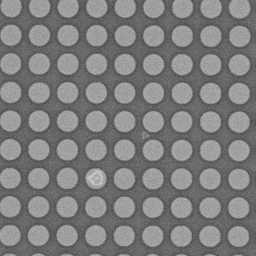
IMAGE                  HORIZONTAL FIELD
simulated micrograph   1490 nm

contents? an array of small figures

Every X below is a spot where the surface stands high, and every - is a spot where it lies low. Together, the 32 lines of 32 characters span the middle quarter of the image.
XXX---XXXXX--XXXXX--XXXXX--XXXXX
XXX---XXXX---XXXX---XXXX---XXXXX
XX-----XX-----XX-----XX------XX-
--------------------------------
--------------------------------
XXX---XXXX---XXXX----XXX----XXX-
XXX---XXXXX--XXXXX--XXXXX--XXXXX
XXX---XXXXX--XXXXX--XXXXX--XXXXX
XXX---XXXX---XXXX---XXXXX--XXXXX
XX-----XX-----XX-----XXX----XXX-
--------------------------------
--------------------------------
XXX---XXXX----XXX----XXX----XXX-
XXX---XXXXX--XXXXX--XXXXX--XXXXX
XXX---XXXXX--XXXXX--XXXXX--XXXXX
XXX---XXXX---XXXXX--XXXXX--XXXXX
XX-----XX-----XXX----XXX----XXX-
--------------------------------
--------------------------------
XX----XXXX----XXX----XXX----XXX-
XXX---XXXX---XXXXX--XXXXX--XXXXX
XXX---XXXX---XXXXX--XXXXX--XXXXX
XXX---XXXX---XXXX---XXXXX--XXXXX
XX----XXXX----XXX----XXX----XXX-
--------------------------------
--------------------------------
XX-----XX-----XX-----XXX----XXX-
XXX---XXXX---XXXX---XXXX---XXXXX
XXX--XXXXX---XXXXX--XXXXX--XXXXX
XXX---XXXX---XXXXX--XXXXX--XXXXX
XXX---XXXX---XXXX---XXXX----XXX-
--------------------------------